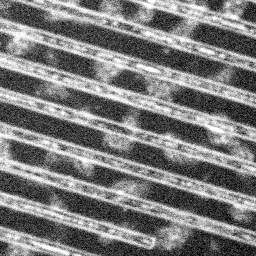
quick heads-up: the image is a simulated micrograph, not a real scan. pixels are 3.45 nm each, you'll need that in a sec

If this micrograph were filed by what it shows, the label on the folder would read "parallel lines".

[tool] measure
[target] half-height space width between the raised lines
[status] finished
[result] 28.1 nanometers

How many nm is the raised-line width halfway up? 84.8